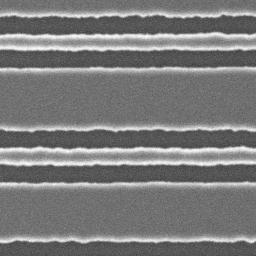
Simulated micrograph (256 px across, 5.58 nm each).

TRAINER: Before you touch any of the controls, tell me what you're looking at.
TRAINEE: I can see lines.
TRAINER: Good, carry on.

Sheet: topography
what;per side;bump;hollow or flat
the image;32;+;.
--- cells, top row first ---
++++++++++++++++++++++++++++++++
++++++++++++++++++++++++++++++++
................................
................................
++++++++++++++++++++++++++++++++
++++++++++++++++++++++++++++++++
................................
................................
...........++.+...++++++..++++++
++++++++++++++++++++++++++++++++
++++++++++++++++++++++++++++++++
++++++++++++++++++++++++++++++++
++++++++++++++++++++++++++++++++
++++++++++++++++++++++++++++++++
++++++++++++++++++++++++++++++++
++++++++++++++++++++++++++++++++
................................
................................
.............................++.
++++++++++++++++++++++++++++++++
.++++++++++++++.+++..++++++.+...
................................
................................
++++++++++++++++++++++++++++++++
++++++++++++++++++++++++++++++++
++++++++++++++++++++++++++++++++
++++++++++++++++++++++++++++++++
++++++++++++++++++++++++++++++++
++++++++++++++++++++++++++++++++
++++++++++++++++++++++++++++++++
................................
................................